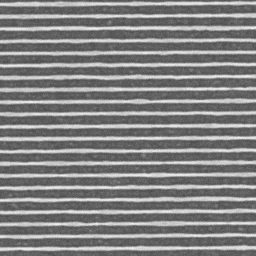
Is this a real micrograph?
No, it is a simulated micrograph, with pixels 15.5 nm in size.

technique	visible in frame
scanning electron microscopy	parallel lines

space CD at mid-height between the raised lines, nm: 147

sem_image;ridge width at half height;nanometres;40.7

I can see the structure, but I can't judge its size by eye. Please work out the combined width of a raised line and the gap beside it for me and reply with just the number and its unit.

190 nm